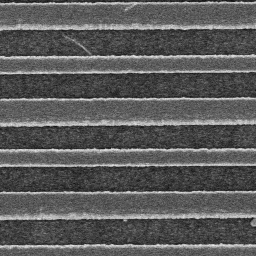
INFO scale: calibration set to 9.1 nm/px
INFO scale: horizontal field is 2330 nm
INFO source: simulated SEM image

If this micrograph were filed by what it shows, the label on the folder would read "lines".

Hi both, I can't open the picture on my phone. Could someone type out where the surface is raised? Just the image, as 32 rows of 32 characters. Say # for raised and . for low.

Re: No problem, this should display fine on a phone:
################################
################################
################################
################################
................................
................................
................................
################################
################################
................................
................................
................................
################################
################################
################################
#############################.##
................................
................................
................................
################################
################################
................................
................................
................................
################################
################################
################################
................................
................................
................................
................................
################################